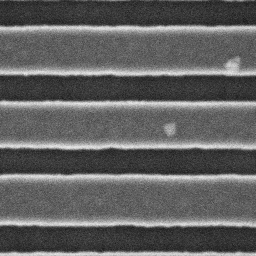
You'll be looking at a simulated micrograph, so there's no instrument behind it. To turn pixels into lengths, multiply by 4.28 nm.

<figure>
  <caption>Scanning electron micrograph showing lines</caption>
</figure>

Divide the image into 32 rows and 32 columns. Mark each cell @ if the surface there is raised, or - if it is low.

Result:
--------------------------------
--------------------------------
--------------------------------
@@@@@@@@@@@@@@@@@@@@@@@@@@@@@@@@
@@@@@@@@@@@@@@@@@@@@@@@@@@@@@@@@
@@@@@@@@@@@@@@@@@@@@@@@@@@@@@@@@
@@@@@@@@@@@@@@@@@@@@@@@@@@@@@@@@
@@@@@@@@@@@@@@@@@@@@@@@@@@@@@@@@
@@@@@@@@@@@@@@@@@@@@@@@@@@@@@@@@
--------------------------------
--------------------------------
--------------------------------
--------------------------------
@@@@@@@@@@@@@@@@@@@@@@@@@@@@@@@@
@@@@@@@@@@@@@@@@@@@@@@@@@@@@@@@@
@@@@@@@@@@@@@@@@@@@@@@@@@@@@@@@@
@@@@@@@@@@@@@@@@@@@@@@@@@@@@@@@@
@@@@@@@@@@@@@@@@@@@@@@@@@@@@@@@@
-------@@@@@@--@--------------@@
--------------------------------
--------------------------------
--------------------------------
@@@@@@@@@@@@@@@@@@@@@@@@@@@@@@@@
@@@@@@@@@@@@@@@@@@@@@@@@@@@@@@@@
@@@@@@@@@@@@@@@@@@@@@@@@@@@@@@@@
@@@@@@@@@@@@@@@@@@@@@@@@@@@@@@@@
@@@@@@@@@@@@@@@@@@@@@@@@@@@@@@@@
@@@@@@@@@@@@@@@@@@@@@@@@@@@@@@@@
--------------------------------
--------------------------------
--------------------------------
--------------------------------